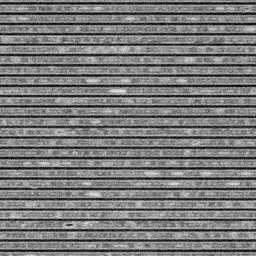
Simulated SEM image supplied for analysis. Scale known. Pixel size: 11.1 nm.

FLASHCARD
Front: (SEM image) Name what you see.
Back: parallel lines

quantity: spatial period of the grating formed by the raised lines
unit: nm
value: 114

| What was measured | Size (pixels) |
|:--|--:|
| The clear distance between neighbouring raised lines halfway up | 3.38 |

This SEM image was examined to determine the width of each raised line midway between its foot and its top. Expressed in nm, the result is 74.6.